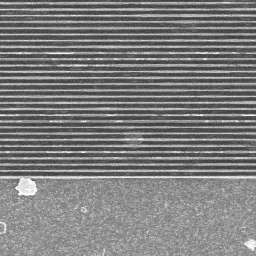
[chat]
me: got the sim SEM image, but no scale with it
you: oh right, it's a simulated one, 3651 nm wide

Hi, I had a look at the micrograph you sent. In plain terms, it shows parallel lines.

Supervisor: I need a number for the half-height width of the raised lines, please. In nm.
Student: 25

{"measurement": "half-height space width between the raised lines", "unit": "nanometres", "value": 64.2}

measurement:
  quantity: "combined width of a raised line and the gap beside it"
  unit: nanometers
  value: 88.5